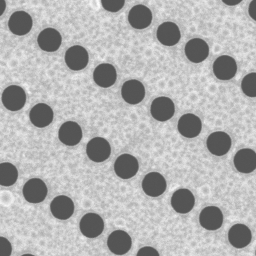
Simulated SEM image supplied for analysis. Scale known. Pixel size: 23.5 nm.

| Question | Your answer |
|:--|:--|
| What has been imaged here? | a regular array of holes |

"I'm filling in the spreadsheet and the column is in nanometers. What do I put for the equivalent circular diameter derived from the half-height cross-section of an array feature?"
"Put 590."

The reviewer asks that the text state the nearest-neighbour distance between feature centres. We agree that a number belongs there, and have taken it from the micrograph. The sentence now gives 766 nm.